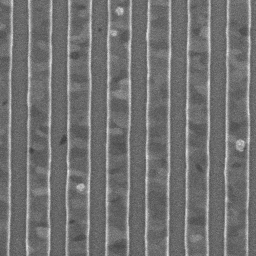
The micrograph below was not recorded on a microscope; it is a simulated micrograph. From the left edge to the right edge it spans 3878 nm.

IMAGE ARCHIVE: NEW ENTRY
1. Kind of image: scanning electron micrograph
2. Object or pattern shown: wiring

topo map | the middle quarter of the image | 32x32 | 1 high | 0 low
01111100000111111000011111000001
01111100000111111000011111000001
01111110000111111000011111000001
01111110000111111000011111000001
01111110000111111000011111000001
01111110000111111000011111000001
01111110000111111000011111000001
01111110000111111000011111000001
01111110000111111000011111000001
01111100000111111000011111000001
01111100000111111000011111000001
01111100000111111000011111000001
01111100000111111000011111000001
01111100000111111000011111000001
01111100000111111000011111000001
01111100000111111000011111000001
01111100000111110000011111000001
01111100000111110000011111000001
01111100000111110000011111000001
01111100000111110000011111000001
01111100000111110000011111000001
01111100000111110000011111000001
01111100000111110000011111000001
01111100000111110000011111000001
01111100000111110000011111000001
01111100000111110000011111000001
01111100000111110000011111000001
01111100000111110000011111000001
01111100000111110000011111000001
01111100000111110000011111000001
01111100000111110000011111000001
01111100000111110000011111000001